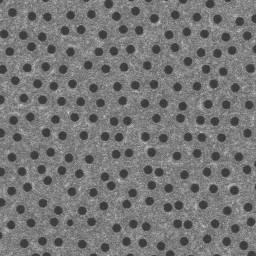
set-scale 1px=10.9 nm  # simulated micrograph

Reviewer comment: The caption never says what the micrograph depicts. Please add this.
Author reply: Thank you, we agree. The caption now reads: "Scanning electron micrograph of a regular array of holes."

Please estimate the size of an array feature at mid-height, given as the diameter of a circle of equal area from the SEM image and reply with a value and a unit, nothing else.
100 nanometers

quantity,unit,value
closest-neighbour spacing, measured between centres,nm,180